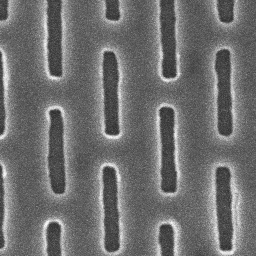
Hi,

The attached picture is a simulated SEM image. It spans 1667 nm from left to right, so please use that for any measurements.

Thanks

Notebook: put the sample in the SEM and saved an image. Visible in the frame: holes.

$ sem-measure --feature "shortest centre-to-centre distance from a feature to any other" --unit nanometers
523